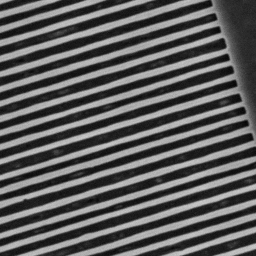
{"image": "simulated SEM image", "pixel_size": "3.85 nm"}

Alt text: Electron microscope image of parallel lines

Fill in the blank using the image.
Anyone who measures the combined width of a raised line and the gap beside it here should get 54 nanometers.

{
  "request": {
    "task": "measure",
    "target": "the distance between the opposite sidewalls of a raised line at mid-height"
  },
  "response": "23.5 nanometers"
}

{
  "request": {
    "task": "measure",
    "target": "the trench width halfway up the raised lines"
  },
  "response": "30.5 nanometers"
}